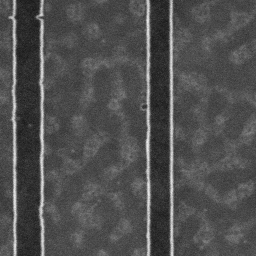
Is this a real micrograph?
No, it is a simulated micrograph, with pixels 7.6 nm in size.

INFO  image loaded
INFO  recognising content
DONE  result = one or a few lines or trenches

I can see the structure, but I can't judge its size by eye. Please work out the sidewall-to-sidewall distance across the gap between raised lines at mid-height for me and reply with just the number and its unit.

803 nanometers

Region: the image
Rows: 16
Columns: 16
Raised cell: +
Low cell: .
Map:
.++......++.....
.++......++.....
.++......++.....
.++......++.....
.++......++.....
.++......++.....
.++......++.....
.++......++.....
.++......++.....
.++......++.....
.++......++.....
.++......++.....
.++......++.....
.++......++.....
.++......++.....
.++......++.....